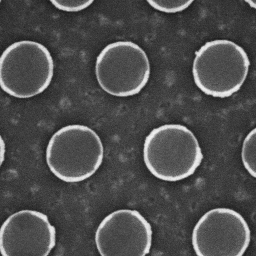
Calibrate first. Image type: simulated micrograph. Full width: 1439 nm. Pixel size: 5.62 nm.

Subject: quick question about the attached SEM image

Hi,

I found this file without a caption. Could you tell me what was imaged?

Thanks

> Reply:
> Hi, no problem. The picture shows raised bodies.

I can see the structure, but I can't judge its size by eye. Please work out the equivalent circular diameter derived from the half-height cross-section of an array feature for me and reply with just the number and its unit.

0.315 micrometres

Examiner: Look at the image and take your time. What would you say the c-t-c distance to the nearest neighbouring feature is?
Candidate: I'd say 546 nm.